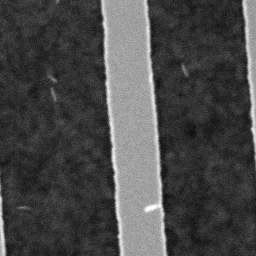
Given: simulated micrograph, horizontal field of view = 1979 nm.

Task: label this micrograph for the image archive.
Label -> one or a few lines or trenches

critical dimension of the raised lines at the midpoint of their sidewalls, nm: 348